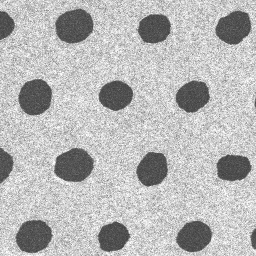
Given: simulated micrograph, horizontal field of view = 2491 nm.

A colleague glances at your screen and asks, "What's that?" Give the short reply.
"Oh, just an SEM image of a regular array of holes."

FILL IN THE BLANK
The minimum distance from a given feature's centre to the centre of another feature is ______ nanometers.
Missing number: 763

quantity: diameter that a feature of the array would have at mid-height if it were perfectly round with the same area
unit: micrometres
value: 0.318